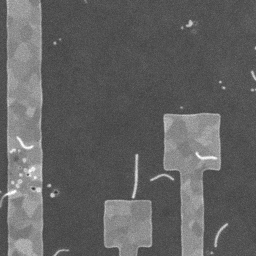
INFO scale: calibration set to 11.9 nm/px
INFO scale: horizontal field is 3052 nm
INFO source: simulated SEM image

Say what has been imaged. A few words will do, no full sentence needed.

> groups of lines, slits or small figures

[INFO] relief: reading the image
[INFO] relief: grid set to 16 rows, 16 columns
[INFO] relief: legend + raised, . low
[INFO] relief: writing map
+++.............
+++.............
+++.............
+++.............
+++.............
+++.............
+++.............
+++.......++++..
+++.......++++..
+++.......++++..
.++.......+++...
+++........++...
+++.....+..++...
.++....++..++...
.++....++..++...
.++....++..++...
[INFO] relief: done